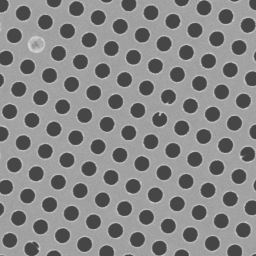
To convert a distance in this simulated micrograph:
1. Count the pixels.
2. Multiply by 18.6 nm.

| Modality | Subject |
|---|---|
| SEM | a regular array of holes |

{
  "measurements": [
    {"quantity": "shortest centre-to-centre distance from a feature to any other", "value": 23.5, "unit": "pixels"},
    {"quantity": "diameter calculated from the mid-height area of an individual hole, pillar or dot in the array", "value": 279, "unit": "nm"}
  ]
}